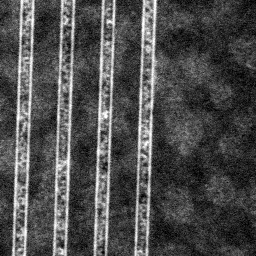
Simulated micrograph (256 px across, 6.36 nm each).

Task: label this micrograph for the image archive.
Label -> parallel lines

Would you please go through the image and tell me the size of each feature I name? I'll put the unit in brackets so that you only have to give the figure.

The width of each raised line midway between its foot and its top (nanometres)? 72.3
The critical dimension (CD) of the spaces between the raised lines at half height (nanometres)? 184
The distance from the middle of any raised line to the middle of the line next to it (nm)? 259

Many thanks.